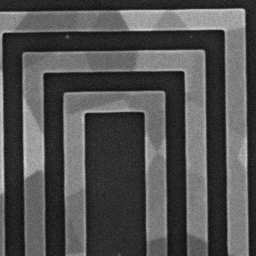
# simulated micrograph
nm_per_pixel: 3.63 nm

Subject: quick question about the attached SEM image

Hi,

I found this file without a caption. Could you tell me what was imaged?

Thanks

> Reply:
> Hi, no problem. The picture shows groups of lines, slits or small figures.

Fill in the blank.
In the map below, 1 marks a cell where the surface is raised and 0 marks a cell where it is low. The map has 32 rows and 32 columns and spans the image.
00000000000000000000000000000000
00000011111111111111111111111110
11111111111111111111111111111110
11111111111111111111111111111110
00000000000000000000000000001110
00000000000000000000000000001110
00000000011111111111111110001110
00011111111111111111111111001110
00011111111111111111111111001110
00011000000000000000000111001110
00011000000000000000000111001110
00011000001111111111000111001110
00011000111111111111100111001110
00011000111111111111100111001110
00011000111000000011100111001110
00011000111000000011100111001110
00011000111000000011100111001110
00011000111000000011100111001110
00011000111000000011100111001110
00011000111000000011100111001110
00011000111000000011100111001110
00011000111000000011100111001110
00011000111000000011100111001110
00011000111000000011100111001110
00011100111000000011100111001110
00011100111000000011100111001110
00011100111000000011100111001110
00011100111000000011100111001110
10011100111000000011100111001110
10011100111000000011100111001110
10011100111000000011100111001110
10011100111000000011100111001110